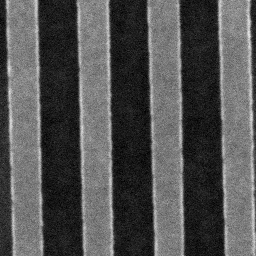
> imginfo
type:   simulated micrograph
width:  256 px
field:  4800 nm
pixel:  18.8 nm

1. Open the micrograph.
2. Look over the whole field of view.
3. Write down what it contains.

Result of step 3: lines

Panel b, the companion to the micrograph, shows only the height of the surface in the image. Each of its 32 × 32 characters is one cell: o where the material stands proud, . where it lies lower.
.oooo.....oooo.....ooo.....oooo.
.oooo.....oooo.....ooo.....oooo.
.oooo.....oooo.....ooo.....oooo.
.oooo.....oooo.....ooo.....oooo.
.oooo.....oooo.....ooo.....oooo.
.oooo.....oooo.....oooo.....ooo.
.oooo.....oooo.....ooo......ooo.
.oooo.....oooo.....oooo.....ooo.
.oooo.....oooo.....oooo.....ooo.
.oooo.....oooo.....oooo.....ooo.
.oooo.....oooo.....oooo.....ooo.
.oooo.....oooo.....oooo.....ooo.
.oooo.....oooo.....oooo.....ooo.
.oooo.....oooo.....oooo.....ooo.
.oooo.....oooo.....oooo.....ooo.
.oooo.....oooo.....oooo.....ooo.
.oooo.....oooo.....oooo.....ooo.
.oooo.....oooo.....oooo.....ooo.
.oooo.....oooo.....oooo.....oooo
.oooo.....oooo.....oooo.....ooo.
.oooo.....oooo.....oooo.....oooo
..ooo.....oooo.....oooo.....oooo
..ooo.....oooo.....oooo.....oooo
..ooo.....oooo.....oooo.....oooo
..ooo.....oooo.....oooo.....oooo
..ooo.....oooo.....oooo.....oooo
..ooo.....oooo.....oooo.....oooo
..ooo.....oooo.....oooo.....oooo
..ooo.....oooo.....oooo.....oooo
..ooo.....oooo.....oooo.....oooo
..ooo.....oooo.....oooo.....oooo
..ooo.....oooo.....oooo.....oooo